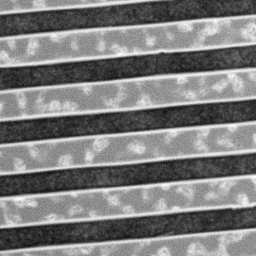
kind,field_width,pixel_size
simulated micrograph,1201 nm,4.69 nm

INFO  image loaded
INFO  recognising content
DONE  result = parallel lines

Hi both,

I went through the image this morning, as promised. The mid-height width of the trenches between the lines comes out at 109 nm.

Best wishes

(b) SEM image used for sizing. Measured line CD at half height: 140 nanometers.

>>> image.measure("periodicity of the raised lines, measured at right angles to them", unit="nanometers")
250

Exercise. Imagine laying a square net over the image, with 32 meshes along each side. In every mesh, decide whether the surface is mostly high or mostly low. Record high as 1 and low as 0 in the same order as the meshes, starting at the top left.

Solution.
11111111111111100000000000000000
11100000000000000000000000000000
00000000000000000000000011111111
00000000000001111111111111111111
00011111111111111111111111111111
11111111111111111111111111111111
11111111111111111111100000000000
11111111110000000000000000000000
00000000000000000000000000000000
00000000000000000000011111111111
00000000001111111111111111111111
11111111111111111111111111111111
11111111111111111111111111111100
11111111111111111110000000000000
11111100000000000000000000000000
00000000000000000000000000000111
00000000000000000111111111111111
00000011111111111111111111111111
11111111111111111111111111111111
11111111111111111111111111000000
11111111111111100000000000000000
11110000000000000000000000000000
00000000000000000000000001111111
00000000000000111111111111111111
00011111111111111111111111111111
11111111111111111111111111111111
11111111111111111111110000000000
11111111111100000000000000000000
00000000000000000000000000000000
00000000000000000000000111111111
00000000001111111111111111111111
11111111111111111111111111111111